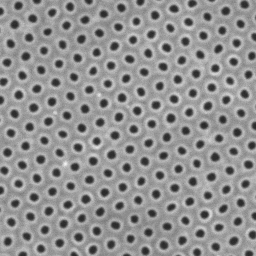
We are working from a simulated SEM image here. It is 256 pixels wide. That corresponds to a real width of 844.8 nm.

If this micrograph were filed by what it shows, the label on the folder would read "a regular array of holes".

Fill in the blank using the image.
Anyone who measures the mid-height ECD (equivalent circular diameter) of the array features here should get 30.1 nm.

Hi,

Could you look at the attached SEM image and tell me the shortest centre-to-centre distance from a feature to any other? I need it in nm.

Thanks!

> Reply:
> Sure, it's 62.7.